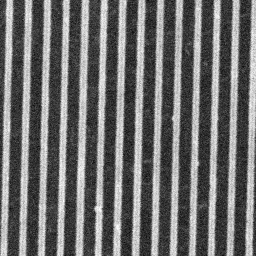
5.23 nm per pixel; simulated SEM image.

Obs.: parallel lines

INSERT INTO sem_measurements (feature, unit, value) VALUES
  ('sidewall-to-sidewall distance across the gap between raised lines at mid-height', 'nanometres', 69.9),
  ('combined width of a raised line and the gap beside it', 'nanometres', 98.6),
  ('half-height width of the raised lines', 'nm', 32.7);